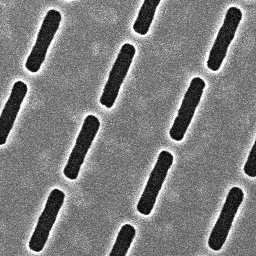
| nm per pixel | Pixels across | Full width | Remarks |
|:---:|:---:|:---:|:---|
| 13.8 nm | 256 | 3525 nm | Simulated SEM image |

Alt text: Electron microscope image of a regular array of holes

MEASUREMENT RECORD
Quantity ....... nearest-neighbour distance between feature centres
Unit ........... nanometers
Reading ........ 1090